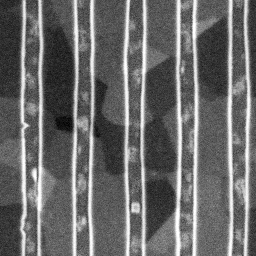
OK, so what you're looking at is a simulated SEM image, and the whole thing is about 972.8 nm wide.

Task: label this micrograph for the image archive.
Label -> parallel lines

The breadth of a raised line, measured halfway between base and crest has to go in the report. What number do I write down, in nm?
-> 139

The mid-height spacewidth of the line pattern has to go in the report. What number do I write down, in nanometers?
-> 57.4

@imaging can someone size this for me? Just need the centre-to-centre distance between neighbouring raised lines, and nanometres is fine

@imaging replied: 196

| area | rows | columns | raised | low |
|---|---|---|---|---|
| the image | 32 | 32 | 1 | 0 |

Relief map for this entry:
11100111100011110011110011111001
11100111110011110011110011111001
11100111110011110011110011111001
11100111110011110011110011111001
11100111100011110011110011111001
11100111110011110011110011111001
11100111110011110011110011111001
11100111110011110011110011111001
11100111110011110011110011111001
11100111110011110011110011111001
11100111110011110011110001111001
11100111110011110011110001111001
11100111100011110011110001111001
11100111100011110011110001111001
11100111100011110011110001111001
11100111100111110011111001111001
11100111100111110011111001111001
11100111100111110011111001111001
11100111100111110011110001111001
11100111100111110011110011111001
11100111100111110011110011111001
11100111100111110011110011111001
11100111100111110011110011111001
11100111100111110011110011111001
11100111100111110011110011111001
11100111100111110011110011111001
11100111100111110011110011111001
11100111100111110011110011111001
11100111100111110011110011111001
11100111100111110011110011111001
11100111100111110011110011111001
11100111100111110011110011111001